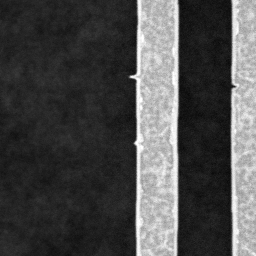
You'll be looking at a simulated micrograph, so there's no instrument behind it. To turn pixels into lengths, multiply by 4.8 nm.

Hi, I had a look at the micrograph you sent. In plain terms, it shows one or a few lines or trenches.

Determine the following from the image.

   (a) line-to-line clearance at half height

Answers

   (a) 275 nm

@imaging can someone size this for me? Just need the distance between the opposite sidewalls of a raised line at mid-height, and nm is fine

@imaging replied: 180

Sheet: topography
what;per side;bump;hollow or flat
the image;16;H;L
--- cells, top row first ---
LLLLLLLLLHHLLLLH
LLLLLLLLLHHLLLLH
LLLLLLLLLHHLLLLH
LLLLLLLLLHHLLLLH
LLLLLLLLLHHLLLLH
LLLLLLLLLHHLLLLH
LLLLLLLLLHHLLLLH
LLLLLLLLLHHLLLLH
LLLLLLLLLHHLLLLH
LLLLLLLLLHHLLLLH
LLLLLLLLLHHLLLLH
LLLLLLLLLHHLLLLH
LLLLLLLLLHHLLLLH
LLLLLLLLLHHLLLLH
LLLLLLLLLHHLLLLH
LLLLLLLLLHHLLLLH